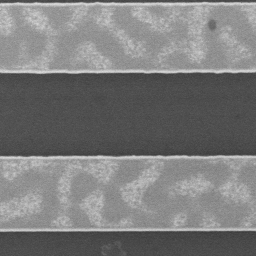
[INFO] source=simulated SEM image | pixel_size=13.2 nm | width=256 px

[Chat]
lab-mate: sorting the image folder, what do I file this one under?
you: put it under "one or a few lines or trenches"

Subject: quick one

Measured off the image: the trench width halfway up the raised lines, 1120 nm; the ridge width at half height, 937 nanometers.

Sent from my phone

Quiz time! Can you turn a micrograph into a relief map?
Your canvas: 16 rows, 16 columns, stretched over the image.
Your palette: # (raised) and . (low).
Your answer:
################
################
################
################
.........#......
................
................
................
................
................
################
################
################
################
................
................